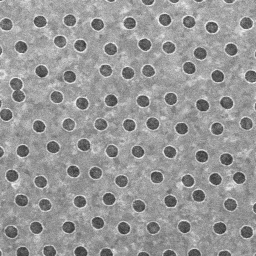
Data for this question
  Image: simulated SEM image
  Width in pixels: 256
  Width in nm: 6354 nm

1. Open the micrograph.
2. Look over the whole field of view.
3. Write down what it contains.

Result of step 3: a regular array of holes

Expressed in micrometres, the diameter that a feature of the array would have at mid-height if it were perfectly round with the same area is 0.321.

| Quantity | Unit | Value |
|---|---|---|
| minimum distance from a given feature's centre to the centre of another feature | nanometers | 620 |